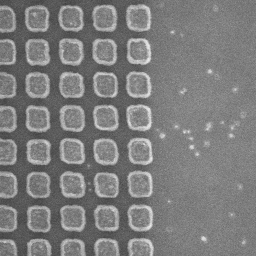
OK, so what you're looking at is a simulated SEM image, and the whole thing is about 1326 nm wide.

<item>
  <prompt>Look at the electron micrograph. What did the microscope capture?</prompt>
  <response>a regular array of raised bodies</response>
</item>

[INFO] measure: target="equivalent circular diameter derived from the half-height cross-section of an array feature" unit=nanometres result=128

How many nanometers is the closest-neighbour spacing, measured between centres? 172